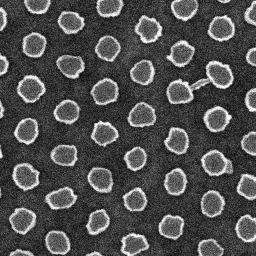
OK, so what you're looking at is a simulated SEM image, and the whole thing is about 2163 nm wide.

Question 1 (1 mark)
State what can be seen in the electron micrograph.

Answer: a regular array of raised bodies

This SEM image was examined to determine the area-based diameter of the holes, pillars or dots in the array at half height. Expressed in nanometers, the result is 204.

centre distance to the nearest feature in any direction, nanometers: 351